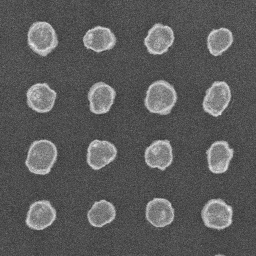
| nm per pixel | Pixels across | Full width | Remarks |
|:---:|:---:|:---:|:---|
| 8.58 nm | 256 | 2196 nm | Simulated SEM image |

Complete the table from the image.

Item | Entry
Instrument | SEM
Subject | a regular array of raised bodies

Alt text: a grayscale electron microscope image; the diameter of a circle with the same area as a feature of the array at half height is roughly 243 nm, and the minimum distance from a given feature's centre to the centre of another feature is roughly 494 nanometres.